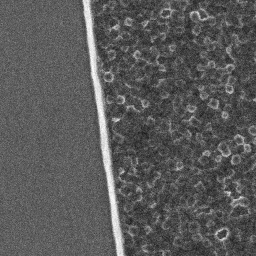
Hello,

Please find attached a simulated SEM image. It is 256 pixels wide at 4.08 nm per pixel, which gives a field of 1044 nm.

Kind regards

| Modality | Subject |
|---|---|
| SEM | one or a few lines or trenches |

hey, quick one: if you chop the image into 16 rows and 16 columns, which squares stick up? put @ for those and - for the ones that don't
-----@@@@@@@@@@@
------@@@@@@@@@@
------@@@@@@@@@@
------@@@@@@@@@@
------@@@@@@@@@@
------@@@@@@@@@@
------@@@@@@@@@@
------@@@@@@@@@@
------@@@@@@@@@@
-------@@@@@@@@@
-------@@@@@@@@@
-------@@@@@@@@@
-------@@@@@@@@@
-------@@@@@@@@@
-------@@@@@@@@@
-------@@@@@@@@@